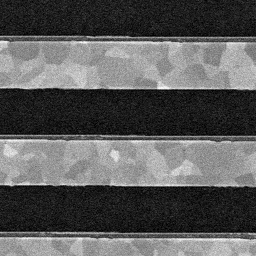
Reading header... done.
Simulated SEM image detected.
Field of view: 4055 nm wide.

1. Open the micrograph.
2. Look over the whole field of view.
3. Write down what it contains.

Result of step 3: lines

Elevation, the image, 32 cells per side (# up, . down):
................................
................................
................................
................................
................................
################################
################################
################################
################################
################################
################################
................................
................................
................................
................................
................................
................................
################################
################################
################################
################################
################################
################################
................................
................................
................................
................................
................................
................................
################################
################################
################################